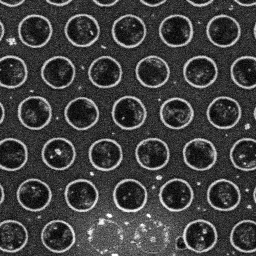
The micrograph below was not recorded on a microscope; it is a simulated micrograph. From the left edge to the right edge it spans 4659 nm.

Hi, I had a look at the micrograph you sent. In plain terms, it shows a regular array of raised bodies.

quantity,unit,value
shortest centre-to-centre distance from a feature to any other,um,0.852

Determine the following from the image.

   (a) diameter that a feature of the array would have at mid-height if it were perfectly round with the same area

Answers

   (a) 586 nm